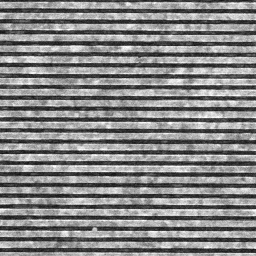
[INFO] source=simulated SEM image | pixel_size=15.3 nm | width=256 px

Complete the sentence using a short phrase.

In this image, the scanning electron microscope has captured parallel lines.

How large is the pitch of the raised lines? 167 nm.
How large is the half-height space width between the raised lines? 0.0747 microns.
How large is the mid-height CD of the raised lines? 90 nm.